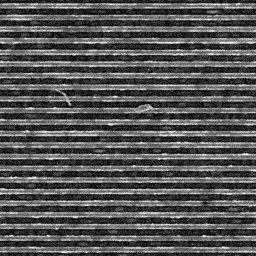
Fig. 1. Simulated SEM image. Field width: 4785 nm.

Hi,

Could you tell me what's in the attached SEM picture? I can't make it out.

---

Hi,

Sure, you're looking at parallel lines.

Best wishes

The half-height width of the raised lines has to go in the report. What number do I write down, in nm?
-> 86.4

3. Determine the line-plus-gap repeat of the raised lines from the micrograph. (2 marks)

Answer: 217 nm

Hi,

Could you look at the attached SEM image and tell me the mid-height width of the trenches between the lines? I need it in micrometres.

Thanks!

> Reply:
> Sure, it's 0.131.